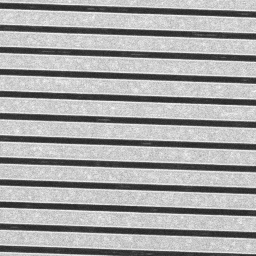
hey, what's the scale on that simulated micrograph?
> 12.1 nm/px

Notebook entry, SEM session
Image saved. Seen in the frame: parallel lines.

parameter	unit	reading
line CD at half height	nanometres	196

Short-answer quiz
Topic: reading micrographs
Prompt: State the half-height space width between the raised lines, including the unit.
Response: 6 pixels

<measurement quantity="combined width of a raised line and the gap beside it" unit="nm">267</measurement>